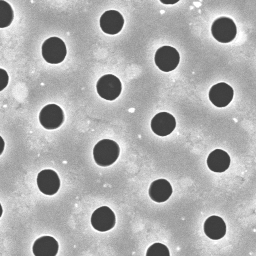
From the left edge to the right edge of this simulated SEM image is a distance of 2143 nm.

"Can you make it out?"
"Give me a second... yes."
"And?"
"a regular array of holes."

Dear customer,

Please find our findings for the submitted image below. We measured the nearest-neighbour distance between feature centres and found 538 nm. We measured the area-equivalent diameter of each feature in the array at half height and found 210 nanometres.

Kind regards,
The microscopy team